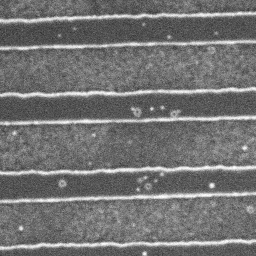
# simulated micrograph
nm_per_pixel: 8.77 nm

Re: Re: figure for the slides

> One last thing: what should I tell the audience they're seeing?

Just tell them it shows lines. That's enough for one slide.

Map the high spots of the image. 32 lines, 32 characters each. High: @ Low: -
--------------------------------
--------------------------------
-@@@@@@@@@@@@@@@@@@@@@@@@@@@@@@@
@@@@@@@@@@@@@@@@@@@@@@@@@@@@@@@@
@@@@@@@@@@@@@@@@@@@@@@@@@@@@@@@@
@@@@@@@@@@@@@@@@@@@@------------
--------------------------------
--------------------------------
--------------------------------
--------------------------------
--------------------------------
-----------@@----@@@@@@@@@@@@@@@
@@@@@@@@@@@@@@@@@@@@@@@@@@@@@@@@
@@@@@@@@@@@@@@@@@@@@@@@@@@@@@@@@
@@@@@@@@@@@@@@@@@@@@@@@@@@@@@@@@
--------------------------------
--------------------------------
--------------------------------
--------------------------------
--------------------------------
--------------------------------
--@@@-@@@@@@@@@@@@@@@@@@@@@@@@@@
@@@@@@@@@@@@@@@@@@@@@@@@@@@@@@@@
@@@@@@@@@@@@@@@@@@@@@@@@@@@@@@@@
@@@@@@@@@@@@@@@@@@@@@@@@@-------
--------------------------------
--------------------------------
--------------------------------
--------------------------------
--------------------------------
------------@@@-@@@@@@@@@@@@@@@@
@@@@@@@@@@@@@@@@@@@@@@@@@@@@@@@@